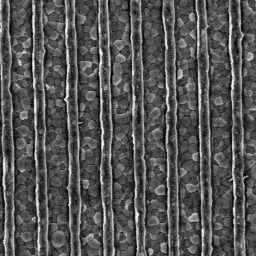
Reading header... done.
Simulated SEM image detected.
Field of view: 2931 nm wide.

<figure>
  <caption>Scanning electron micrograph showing parallel lines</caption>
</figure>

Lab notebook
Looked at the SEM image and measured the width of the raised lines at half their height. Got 0.12 um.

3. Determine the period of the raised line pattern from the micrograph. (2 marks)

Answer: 0.376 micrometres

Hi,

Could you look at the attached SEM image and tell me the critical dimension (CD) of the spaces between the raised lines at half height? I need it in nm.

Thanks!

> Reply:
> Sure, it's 262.